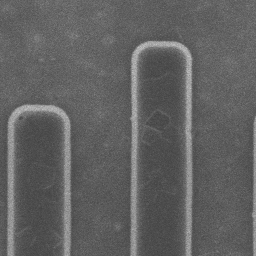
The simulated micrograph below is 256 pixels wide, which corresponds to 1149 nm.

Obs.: one or a few lines or trenches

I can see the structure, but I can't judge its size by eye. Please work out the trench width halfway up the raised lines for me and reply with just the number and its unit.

0.291 micrometres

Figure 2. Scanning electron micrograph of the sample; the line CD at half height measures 0.256 um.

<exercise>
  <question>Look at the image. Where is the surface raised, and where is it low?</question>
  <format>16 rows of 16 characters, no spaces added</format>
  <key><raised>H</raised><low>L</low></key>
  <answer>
LLLLLLLLLLLLLLLL
LLLLLLLLLLLLLLLL
LLLLLLLLLLLLLLLL
LLLLLLLLHHHHLLLL
LLLLLLLLHHHHLLLL
LLLLLLLLHHHHLLLL
LLLLLLLLHHHHLLLL
LHHHLLLLHHHHLLLL
LHHHLLLLHHHHLLLL
LHHHLLLLHHHHLLLL
LHHHLLLLHHHHLLLL
LHHHLLLLHHHHLLLL
LHHHLLLLHHHHLLLL
LHHHLLLLHHHHLLLL
LHHHLLLLHHHHLLLL
LHHHLLLLHHHHLLLL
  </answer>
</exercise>